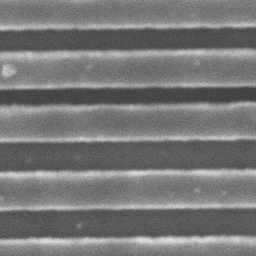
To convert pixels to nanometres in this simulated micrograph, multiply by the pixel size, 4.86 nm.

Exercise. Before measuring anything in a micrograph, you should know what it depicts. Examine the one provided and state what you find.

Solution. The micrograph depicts lines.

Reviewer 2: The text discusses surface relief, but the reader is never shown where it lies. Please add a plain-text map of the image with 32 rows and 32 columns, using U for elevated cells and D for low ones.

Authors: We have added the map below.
UUUUUUUUUUUUUUUUUUUUUUUUUUUUUUUU
UUUUUUUUUUUUUUUUUUUUUUUUUUUUUUUU
UUUUUUUUUUUUUUUUUUUUUUUUUUUUUUUU
UUUUUUUUUUUUUUUUUUDUUDUDDDDDDDDD
DDDDDDDDDDDDDDDDDDDDDDDDDDDDDDDD
DDDDDDDDDDDDDDDDDDDDDDDDDDDDDDDD
DDDDDDDDDUUUUUUUUUUUUUUUUUUUUUUU
UUUUUUUUUUUUUUUUUUUUUUUUUUUUUUUU
UUUUUUUUUUUUUUUUUUUUUUUUUUUUUUUU
UUUUUUUUUUUUUUUUUUUUUUUUUUUUUUUU
UUUUUUUUUUUUUUUUUUUUUUUUUUUUUUUU
DDDDDDDDDDDDDDDDDDDDDDDDDDDDDDDD
DDDDDDDDDDDDDDDDDDDDDDDDDDDDDDDD
UUUUUUUUUUUUUUUUUUUUUUUUUUUUUUUU
UUUUUUUUUUUUUUUUUUUUUUUUUUUUUUUU
UUUUUUUUUUUUUUUUUUUUUUUUUUUUUUUU
UUUUUUUUUUUUUUUUUUUUUUUUUUUUUUUU
UUUUUUUUUUUUUUUUUUUUDDDDDDDDDDDD
DDDDDDDDDDDDDDDDDDDDDDDDDDDDDDDD
DDDDDDDDDDDDDDDDDDDDDDDDDDDDDDDD
DDDDDDDDDDDDDDDDDDDDDDDDDDDDDDDD
DDDDDDDDDDDDDDDDDUUUUUUUUUUUUUUU
UUUUUUUUUUUUUUUUUUUUUUUUUUUUUUUU
UUUUUUUUUUUUUUUUUUUUUUUUUUUUUUUU
UUUUUUUUUUUUUUUUUUUUUUUUUUUUUUUU
UUUUUUUUUUUUUUUUUUUUUUUUUUUUUUUU
DDDDDDDDDDDDDDDDDDDDDDDDDDDDDDDD
DDDDDDDDDDDDDDDDDDDDDDDDDDDDDDDD
DDDDDDDDDDDDDDDDDDDDDDDDDDDDDDDD
DDDDDDDDDDDDDDDDDDDDDDDDDDDDDDDD
UUUUUUUUUUUUUUUUUUUUUUUUUUUUUUUU
UUUUUUUUUUUUUUUUUUUUUUUUUUUUUUUU